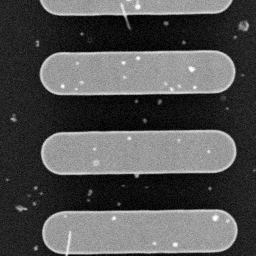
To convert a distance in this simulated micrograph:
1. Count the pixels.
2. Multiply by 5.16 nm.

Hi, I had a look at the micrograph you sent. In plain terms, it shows groups of lines, slits or small figures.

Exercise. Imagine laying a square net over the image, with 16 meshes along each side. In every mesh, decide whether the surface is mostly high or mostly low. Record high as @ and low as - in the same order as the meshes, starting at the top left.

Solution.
---@@@@@@@@@@@--
----------------
----------------
---@@@@@@@@@@@--
---@@@@@@@@@@@@-
---@@@@@@@@@@@--
----------------
----------------
---@@@@@@@@@@@--
---@@@@@@@@@@@@-
---@@@@@@@@@@@--
----------------
----------------
---@@@@@@@@@@@--
---@@@@@@@@@@@@-
---@@@@@@@@@@@--